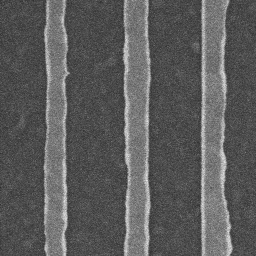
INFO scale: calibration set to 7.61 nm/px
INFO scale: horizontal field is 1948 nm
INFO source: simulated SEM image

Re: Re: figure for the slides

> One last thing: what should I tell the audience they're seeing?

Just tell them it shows one or a few lines or trenches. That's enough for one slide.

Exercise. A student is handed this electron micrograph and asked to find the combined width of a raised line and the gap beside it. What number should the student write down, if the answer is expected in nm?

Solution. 602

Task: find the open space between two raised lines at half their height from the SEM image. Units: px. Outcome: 58.2